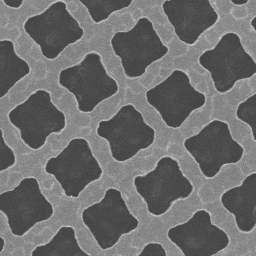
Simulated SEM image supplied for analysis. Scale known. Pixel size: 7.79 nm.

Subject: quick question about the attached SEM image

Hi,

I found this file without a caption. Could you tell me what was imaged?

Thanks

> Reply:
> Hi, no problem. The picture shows a regular array of holes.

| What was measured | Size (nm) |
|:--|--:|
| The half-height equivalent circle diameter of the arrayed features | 389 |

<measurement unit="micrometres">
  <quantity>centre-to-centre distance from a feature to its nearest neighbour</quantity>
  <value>0.474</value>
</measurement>